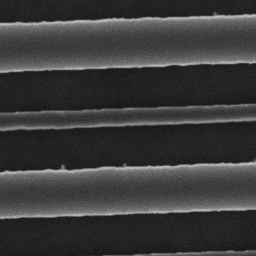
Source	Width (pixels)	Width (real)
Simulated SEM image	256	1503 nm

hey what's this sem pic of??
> lines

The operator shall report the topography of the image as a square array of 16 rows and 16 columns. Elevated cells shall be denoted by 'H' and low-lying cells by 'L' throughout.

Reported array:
LLLLLLLLLLLLLLLL
HHHHHHHHHHHHHHHH
HHHHHHHHHHHHHHHH
HHHHHHHHHHHHHHHH
HLLLLLLLLLLLLLLL
LLLLLLLLLLLLLLLL
LLLLLLLLLLLLLLLL
LLLLLLLLLLLLLLLL
LLLLLLLLLLLLLLLL
LLLLLLLLLLLLLLLL
LLLLLLHHHHHHHHHH
HHHHHHHHHHHHHHHH
HHHHHHHHHHHHHHHH
HHHHLLLLLLLLLLLL
LLLLLLLLLLLLLLLL
LLLLLLLLLLLLLLLL